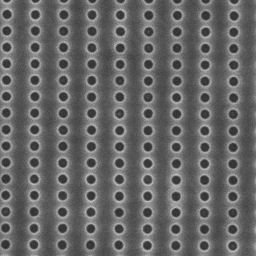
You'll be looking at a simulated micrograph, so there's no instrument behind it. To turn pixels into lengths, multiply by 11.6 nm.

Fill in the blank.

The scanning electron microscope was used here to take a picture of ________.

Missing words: a regular array of holes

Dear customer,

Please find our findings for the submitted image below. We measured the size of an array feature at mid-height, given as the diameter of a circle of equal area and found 115 nm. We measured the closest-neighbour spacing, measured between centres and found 0.19 µm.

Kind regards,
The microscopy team